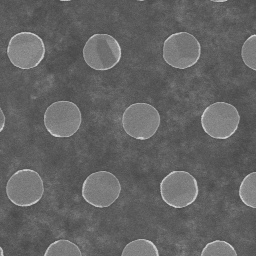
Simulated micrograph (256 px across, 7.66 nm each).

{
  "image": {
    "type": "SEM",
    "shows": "a regular array of raised bodies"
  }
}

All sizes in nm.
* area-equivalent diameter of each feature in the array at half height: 284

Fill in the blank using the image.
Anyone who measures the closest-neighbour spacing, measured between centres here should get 594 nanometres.